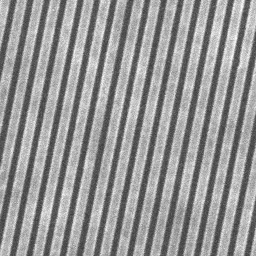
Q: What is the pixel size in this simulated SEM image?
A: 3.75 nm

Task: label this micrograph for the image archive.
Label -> parallel lines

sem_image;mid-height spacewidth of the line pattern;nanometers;28.1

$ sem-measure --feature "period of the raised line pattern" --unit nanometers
61.6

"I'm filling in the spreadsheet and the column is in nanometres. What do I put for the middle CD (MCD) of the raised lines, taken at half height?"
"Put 31.3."